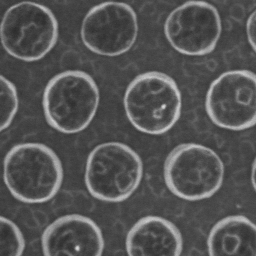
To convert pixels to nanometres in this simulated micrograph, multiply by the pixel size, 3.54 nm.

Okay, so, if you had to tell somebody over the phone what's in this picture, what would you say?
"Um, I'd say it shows a regular array of raised bodies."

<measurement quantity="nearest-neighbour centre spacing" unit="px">80.9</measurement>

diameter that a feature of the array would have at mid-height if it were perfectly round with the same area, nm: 199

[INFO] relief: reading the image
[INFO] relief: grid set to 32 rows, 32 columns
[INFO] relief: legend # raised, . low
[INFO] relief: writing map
..##.........###........##......
.#####.....######.....#####.....
#######....######....######....#
#######...#######....######....#
#######...#######....######....#
######.....######....######.....
.#####......###.......####......
................................
................................
.......###........##........###.
#.....######....######.....#####
##....######....######....######
##....######....######....######
##....######....######....######
#.....######....######....######
#......####......####......####.
........##........##............
................................
..###.......####.......###......
.######....######.....#####.....
.######....######....#######....
.######....######....#######....
.######....######....#######...#
.######....######....######.....
..####......####.......###......
................................
................................
#.......###.......##.........#..
##....######.....####......#####
###...#######...######....######
###...#######...######....######
###...#######...######....######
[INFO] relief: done